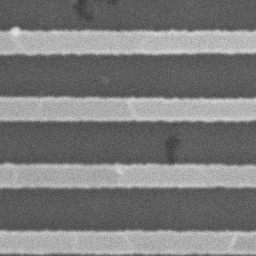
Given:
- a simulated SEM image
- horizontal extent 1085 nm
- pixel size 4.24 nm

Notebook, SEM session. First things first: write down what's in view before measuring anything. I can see lines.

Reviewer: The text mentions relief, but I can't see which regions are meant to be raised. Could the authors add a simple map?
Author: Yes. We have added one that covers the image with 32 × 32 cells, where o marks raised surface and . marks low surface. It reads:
................................
................................
................................
................................
oooooooooooooooooooooooooooooooo
oooooooooooooooooooooooooooooooo
oooooooooooooooooooooooooooooooo
................................
................................
................................
................................
................................
oooooooooooooooooooooooooooooooo
oooooooooooooooooooooooooooooooo
oooooooooooooooooooooooooooooooo
................................
................................
................................
................................
................................
................................
oooooooooooooooooooooooooooooooo
oooooooooooooooooooooooooooooooo
................................
................................
................................
................................
................................
................................
oooooooooooooooooooooooooooooooo
oooooooooooooooooooooooooooooooo
oooooooooooooooooooooooooooooooo